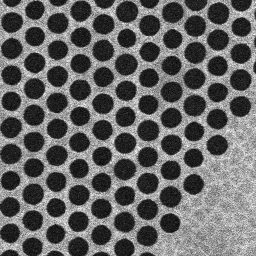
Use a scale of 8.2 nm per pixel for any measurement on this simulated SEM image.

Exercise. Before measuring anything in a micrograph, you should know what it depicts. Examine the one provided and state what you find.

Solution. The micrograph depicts a regular array of holes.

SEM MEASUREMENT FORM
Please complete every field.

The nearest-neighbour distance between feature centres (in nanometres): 214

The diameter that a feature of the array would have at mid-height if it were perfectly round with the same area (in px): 20.5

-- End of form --